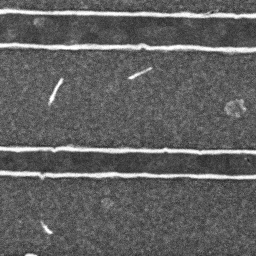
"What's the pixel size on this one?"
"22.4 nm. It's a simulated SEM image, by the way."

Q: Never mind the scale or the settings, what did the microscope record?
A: one or a few lines or trenches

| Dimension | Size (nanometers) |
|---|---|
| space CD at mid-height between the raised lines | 2300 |